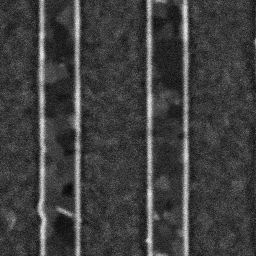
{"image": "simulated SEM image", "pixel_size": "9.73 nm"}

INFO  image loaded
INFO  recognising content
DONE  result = one or a few lines or trenches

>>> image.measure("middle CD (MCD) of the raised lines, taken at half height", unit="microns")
0.36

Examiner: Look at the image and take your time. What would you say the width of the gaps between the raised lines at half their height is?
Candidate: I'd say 688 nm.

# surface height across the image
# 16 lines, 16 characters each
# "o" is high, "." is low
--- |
...oo....ooo....
...oo....ooo....
...oo....ooo....
...oo....ooo....
...oo....ooo....
...oo....ooo....
...oo....ooo....
...oo....ooo....
...oo....ooo....
...oo....ooo....
...oo....ooo....
...oo....ooo....
...oo....ooo....
...oo....ooo....
...oo....ooo....
...oo....ooo....